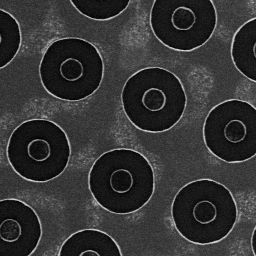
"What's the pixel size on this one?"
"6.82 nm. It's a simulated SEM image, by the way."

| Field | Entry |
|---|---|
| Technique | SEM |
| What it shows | ring-shaped grooves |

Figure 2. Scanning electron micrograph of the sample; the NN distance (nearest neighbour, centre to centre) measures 0.597 micrometres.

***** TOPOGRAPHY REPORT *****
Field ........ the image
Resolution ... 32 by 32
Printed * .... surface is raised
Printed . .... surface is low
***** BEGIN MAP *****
*********.......***........*****
.*********.....****...**...*****
..*****************...**...****.
..*****************...**...***..
...*****************......***...
...***.....**********....****...
..****......*****************...
.****...*....****************...
*****...**...*****************..
*****...**...****.....*********.
*****.......****.......*********
******......***...**...*********
********..*****...***..*********
****************..**...****.....
****************.......***......
***....**********.....****...*..
**......*****************...***.
*.......******************...*..
*...**...*****************......
*...**...****.....*********.....
*.......****.......*************
**......***...**...*************
****..*****...***..******.******
***********...**...****.....****
************.......***.......***
...*********......****...*...***
....**********..******..***...**
.*...*****************...*...***
***..*****************.......***
**...****.....*********.....****
.....***.......****************.
....***....*...*****************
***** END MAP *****